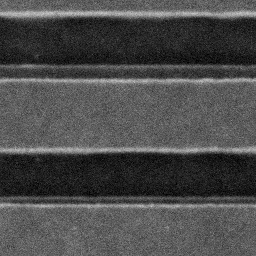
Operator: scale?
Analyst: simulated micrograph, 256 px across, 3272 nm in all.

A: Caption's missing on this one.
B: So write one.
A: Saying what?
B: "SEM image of lines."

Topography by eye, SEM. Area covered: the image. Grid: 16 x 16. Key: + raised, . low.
++++++++++++++++
................
................
................
++++++++++++++++
++++++++++++++++
++++++++++++++++
++++++++++++++++
++++++++++++++++
................
................
................
++++++++++++++++
++++++++++++++++
++++++++++++++++
++++++++++++++++